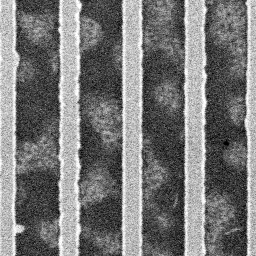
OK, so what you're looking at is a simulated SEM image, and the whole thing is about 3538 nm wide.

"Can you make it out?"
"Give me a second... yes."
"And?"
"one or a few lines or trenches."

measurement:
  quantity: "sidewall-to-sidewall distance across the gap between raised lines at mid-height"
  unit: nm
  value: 624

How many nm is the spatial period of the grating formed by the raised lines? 866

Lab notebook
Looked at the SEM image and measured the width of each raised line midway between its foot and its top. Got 238 nanometers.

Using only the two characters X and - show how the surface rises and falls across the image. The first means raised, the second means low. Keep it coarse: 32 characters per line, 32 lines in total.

XX------XX------XX-----XXX-----X
XX------XX------X------XXX-----X
XX------XX------X------XXX-----X
XX------XX------XX-----XX------X
XX------XX------XX-----XXX-----X
XX------XX------X------XXX-----X
XX------XX------XX-----XXX-----X
XX------XX------XX-----XXX-----X
XX------XX------XX-----XX------X
XX------XX------XX-----XXX-----X
XX------XX------XX-----XX------X
XX------XX------XX-----XX------X
XX------XX------X------XX------X
XX------XX------XX-----XX------X
XX------XX------XX-----XX------X
XX------XX------XX-----XX------X
XX------XX------XX-----XX------X
XX------XX------X------XX------X
XX------XX------XX-----XX------X
XX------XX------X------XX------X
XX------XX------XX-----XX------X
XX------XX------XX-----XX------X
XX------XX------XX-----XX------X
XX------XX------XX-----XX------X
XX-----XXX------XX-----XX------X
XX-----XXX-----XXX-----XX------X
XX------XX-----XXX-----XX------X
XX------XX-----XXX-----XX------X
XX------XX------XX-----XX------X
XX------XX------XX-----XX------X
XX------XX------XX-----XX------X
XX------XX------XX-----XX------X